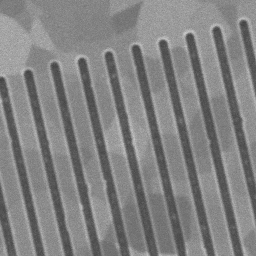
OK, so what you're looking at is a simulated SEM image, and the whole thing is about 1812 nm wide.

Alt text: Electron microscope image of parallel lines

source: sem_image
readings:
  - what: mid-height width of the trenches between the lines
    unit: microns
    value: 0.0716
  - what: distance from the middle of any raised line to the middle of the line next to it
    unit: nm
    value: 196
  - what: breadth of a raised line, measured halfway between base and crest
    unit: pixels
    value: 17.3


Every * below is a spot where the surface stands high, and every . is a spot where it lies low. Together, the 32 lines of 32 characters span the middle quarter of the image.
***...****...*****..*****..*****
****..*****...****...****...****
****..*****...****...****...****
****...****...****...****...****
****...****...****...*****..****
*****..*****..*****..*****..****
*****..*****...****...****...***
.****...****...****...****...***
.****...****...****...*****..***
.****...****...*****..*****..***
.*****..*****...****...****...**
.*****...****...****...****...**
..****...****...****...****...**
..****...****...*****..*****..**
..*****..*****..*****..*****...*
..*****..*****...****...****...*
...****...****...****...****...*
...****...****...*****..*****..*
...****...****...*****..*****..*
*..*****..*****..*****...****...
*...****...****...****...****...
*...****...****...****...****...
*...****...****...*****..*****..
**..*****..*****..*****...****..
**..*****..*****...****...****..
**...****...****...****...****..
**...****...****...*****..*****.
**...****...*****..*****..*****.
***..*****..*****..*****...****.
***...****...****...****...****.
***...****...****...****...****.
***...****...****...*****..*****